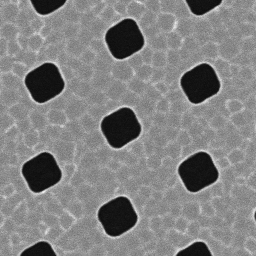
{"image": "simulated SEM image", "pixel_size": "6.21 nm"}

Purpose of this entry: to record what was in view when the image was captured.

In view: holes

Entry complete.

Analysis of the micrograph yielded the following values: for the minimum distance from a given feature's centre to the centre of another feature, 0.544 µm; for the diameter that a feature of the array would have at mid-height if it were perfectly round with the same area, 0.235 microns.